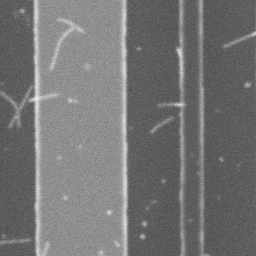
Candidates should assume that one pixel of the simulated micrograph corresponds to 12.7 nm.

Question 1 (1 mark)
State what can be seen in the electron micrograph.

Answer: lines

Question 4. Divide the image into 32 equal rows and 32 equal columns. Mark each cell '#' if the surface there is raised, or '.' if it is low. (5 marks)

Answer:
....############.......##.......
....############.......##.......
....############.......##.......
....############.......##.......
....############.......##.......
....############.......##.......
....############.......##.......
....############......###.......
....############.......##.......
....############.......##.......
....############.......##.......
....############.......##.......
....############.......##.......
....############.......##.......
....############.......##.......
....############.......##.......
....############.......##.......
....############.......##.......
....############.......##.......
.....###########.......##.......
.....###########.......##.......
.....###########.......##.......
.....###########.......##.......
.....###########.......##.......
.....###########.......##.......
....############.......##.......
....############.......##.......
.....###########.......##.......
.....###########.......##.......
....############.......##.......
.....###########.......##.......
.....###########.......##.......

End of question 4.